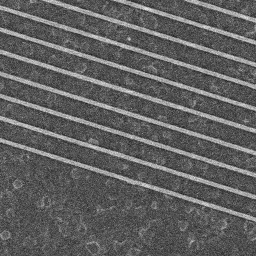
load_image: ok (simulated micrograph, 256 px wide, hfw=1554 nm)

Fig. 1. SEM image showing parallel lines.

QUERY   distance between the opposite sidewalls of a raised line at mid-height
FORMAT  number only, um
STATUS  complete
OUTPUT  0.0211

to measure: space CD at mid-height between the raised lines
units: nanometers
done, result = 106